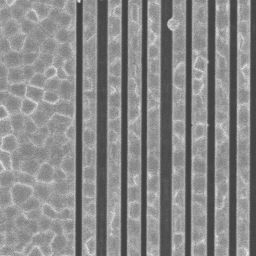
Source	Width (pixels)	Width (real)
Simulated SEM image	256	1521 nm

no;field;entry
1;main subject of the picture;parallel lines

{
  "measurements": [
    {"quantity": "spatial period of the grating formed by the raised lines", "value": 131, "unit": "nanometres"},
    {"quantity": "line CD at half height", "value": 89.1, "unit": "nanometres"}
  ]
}